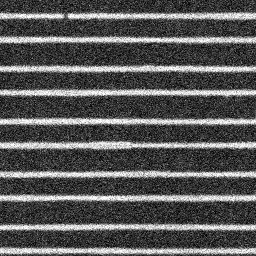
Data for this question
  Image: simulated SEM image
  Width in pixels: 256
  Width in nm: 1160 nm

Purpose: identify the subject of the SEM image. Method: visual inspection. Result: parallel lines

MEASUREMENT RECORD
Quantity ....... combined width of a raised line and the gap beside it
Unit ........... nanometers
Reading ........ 118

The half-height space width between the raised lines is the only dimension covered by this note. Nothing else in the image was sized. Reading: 19.8 pixels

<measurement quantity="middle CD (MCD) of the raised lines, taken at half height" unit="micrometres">0.0221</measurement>